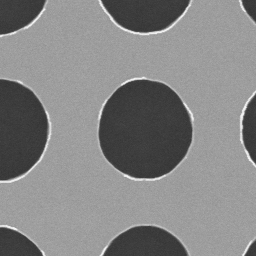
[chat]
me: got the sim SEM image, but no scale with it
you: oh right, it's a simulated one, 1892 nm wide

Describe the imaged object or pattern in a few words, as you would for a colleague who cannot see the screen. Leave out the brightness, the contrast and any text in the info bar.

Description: holes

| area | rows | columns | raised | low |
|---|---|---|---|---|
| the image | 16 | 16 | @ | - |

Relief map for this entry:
---@@@@-----@@@-
--@@@@@----@@@@@
@@@@@@@@@@@@@@@@
@@@@@@@@@@@@@@@@
@@@@@@@@@@@@@@@@
--@@@@@----@@@@@
---@@@@----@@@@@
---@@@------@@@-
---@@@------@@@-
---@@@------@@@-
--@@@@@----@@@@@
@@@@@@@@@@@@@@@@
@@@@@@@@@@@@@@@@
@@@@@@@@@@@@@@@@
-@@@@@@@--@@@@@@
--@@@@@-----@@@@